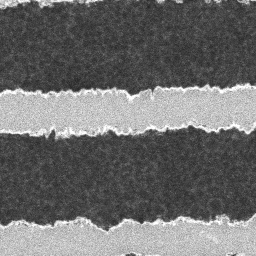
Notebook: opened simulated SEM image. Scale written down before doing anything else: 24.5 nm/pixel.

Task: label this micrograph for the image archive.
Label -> one or a few lines or trenches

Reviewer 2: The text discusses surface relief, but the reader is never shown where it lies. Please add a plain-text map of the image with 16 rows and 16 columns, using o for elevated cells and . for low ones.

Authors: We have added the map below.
oooooooooooooooo
oooooooooooooooo
oooooooooooooooo
oooooooooooooooo
oooooooooooooooo
ooooooooooooooo.
................
................
oooooooooooooooo
oooooooooooooooo
oooooooooooooooo
oooooooooooooooo
oooooooooooooooo
oooooooooooooooo
................
................